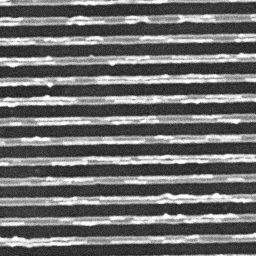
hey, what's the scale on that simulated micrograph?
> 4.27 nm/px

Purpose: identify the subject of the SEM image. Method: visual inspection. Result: parallel lines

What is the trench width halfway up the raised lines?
55.5 nanometers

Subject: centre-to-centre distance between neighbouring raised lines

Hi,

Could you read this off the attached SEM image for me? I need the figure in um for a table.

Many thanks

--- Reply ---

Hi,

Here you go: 0.0855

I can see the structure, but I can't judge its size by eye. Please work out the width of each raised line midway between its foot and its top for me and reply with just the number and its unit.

6.86 pixels